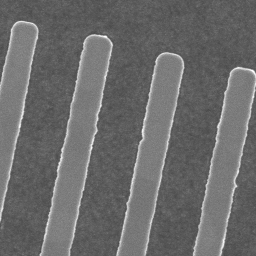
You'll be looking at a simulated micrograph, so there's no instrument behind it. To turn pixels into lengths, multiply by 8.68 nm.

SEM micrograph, one or a few lines or trenches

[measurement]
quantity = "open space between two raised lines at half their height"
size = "400 nm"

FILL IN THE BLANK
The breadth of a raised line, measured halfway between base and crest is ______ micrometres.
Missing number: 0.247